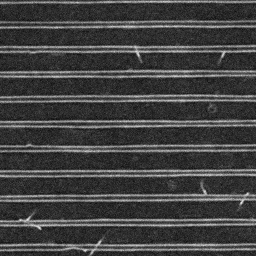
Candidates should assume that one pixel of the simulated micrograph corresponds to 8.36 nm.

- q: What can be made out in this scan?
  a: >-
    parallel lines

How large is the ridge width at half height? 46 nm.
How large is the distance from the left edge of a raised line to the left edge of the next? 207 nm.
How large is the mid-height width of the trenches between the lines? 160 nm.